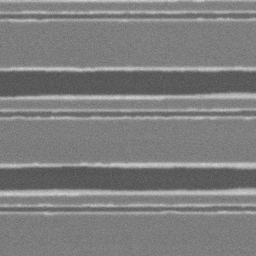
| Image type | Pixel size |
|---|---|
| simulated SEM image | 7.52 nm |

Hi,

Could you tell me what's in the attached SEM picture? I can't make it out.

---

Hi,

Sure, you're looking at lines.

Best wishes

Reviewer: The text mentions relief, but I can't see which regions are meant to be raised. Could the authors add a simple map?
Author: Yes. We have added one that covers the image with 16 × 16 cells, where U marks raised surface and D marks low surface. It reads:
UUUUUUUUUUUUUUUU
UUUUUUUUUUUUUUUU
UUUUUUUUUUUUUUUU
UUUUUUUUUUUUUUUU
DDDDDDDDDDDDDDDD
DDDDDDDDDDDDDDDD
UUUUUUUUUUUUUUUU
UUUUUUUUUUUUUUUU
UUUUUUUUUUUUUUUU
UUUUUUUUUUUUUUUU
DDDDDDDDDDDDDDDD
DDDDDDDDDDDDDDDD
UUUUUUUUUUUUUUUU
UUUUUUUUUUUUUUUU
UUUUUUUUUUUUUUUU
UUUUUUUUUUUUUUUU